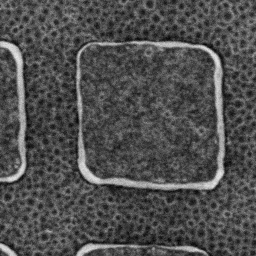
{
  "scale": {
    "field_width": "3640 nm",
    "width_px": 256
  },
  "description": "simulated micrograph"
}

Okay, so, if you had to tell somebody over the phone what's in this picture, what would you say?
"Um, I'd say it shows raised bodies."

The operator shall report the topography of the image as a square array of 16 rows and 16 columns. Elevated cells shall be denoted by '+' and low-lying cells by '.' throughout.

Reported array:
................
................
................
+....++++++++...
+....+++++++++..
+....+++++++++..
+....+++++++++..
+....+++++++++..
+....+++++++++..
+....+++++++++..
+....+++++++++..
.........++++...
................
................
................
......++++++....